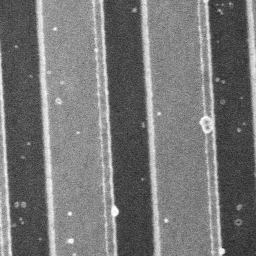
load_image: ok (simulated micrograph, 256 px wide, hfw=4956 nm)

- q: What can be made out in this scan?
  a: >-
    lines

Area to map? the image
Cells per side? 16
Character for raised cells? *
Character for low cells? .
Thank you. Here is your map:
...***...****...
...***...****...
...***...****...
...****..****...
...****..****...
...****..****...
...****..****...
...****..****...
...****...***...
...****...***...
...****...***...
...****...****..
...****...****..
*..****...****..
*..****...****..
*..****...****..